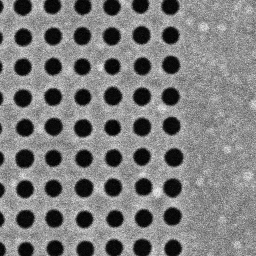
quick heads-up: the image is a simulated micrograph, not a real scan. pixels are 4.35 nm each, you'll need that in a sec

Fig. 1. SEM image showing a regular array of holes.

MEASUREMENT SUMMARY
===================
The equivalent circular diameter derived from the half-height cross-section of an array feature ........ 79.5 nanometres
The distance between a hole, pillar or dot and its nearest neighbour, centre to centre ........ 126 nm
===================